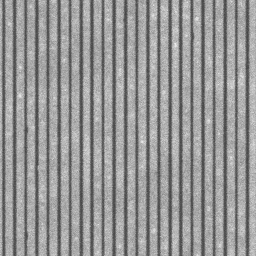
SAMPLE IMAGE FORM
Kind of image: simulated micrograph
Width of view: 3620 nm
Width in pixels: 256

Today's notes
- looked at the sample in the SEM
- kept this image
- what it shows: parallel lines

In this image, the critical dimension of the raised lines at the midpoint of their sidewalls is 0.11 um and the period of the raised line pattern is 156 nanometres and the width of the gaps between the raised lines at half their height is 0.0548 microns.